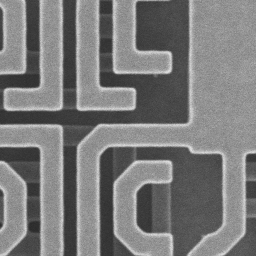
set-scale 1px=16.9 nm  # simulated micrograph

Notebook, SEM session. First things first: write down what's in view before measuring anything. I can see wiring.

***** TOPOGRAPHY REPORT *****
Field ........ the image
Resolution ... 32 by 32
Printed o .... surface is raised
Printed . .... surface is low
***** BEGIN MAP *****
ooo..ooo..oo..ooo.......oooooooo
ooo..ooo..oo..ooo.......oooooooo
.oo..ooo..oo..ooo.......oooooooo
.oo..ooo..oo..ooo.......oooooooo
.oo..ooo..oo..ooo.......oooooooo
.oo..ooo..oo..ooo.......oooooooo
ooo..ooo..oo..oooooo....oooooooo
ooo..ooo..oo..ooooooo...oooooooo
ooo..ooo..oo..ooooooo...oooooooo
.....ooo..oo............oooooooo
.....ooo..ooo...........oooooooo
.ooooooo..ooooooo.......oooooooo
.ooooooo..ooooooo.......oooooooo
.ooooooo..ooooooo.......oooooooo
........................oooooooo
.......................ooooooooo
oooooooo...ooooooooooooooooooooo
oooooooo..oooooooooooooooooooooo
.....ooo..ooo..........ooooooooo
.....ooo..ooo...............ooo.
o....ooo..oo.....oooo.......ooo.
oo...ooo..oo...oooooo.......ooo.
ooo..ooo..oo...oooooo.......ooo.
ooo..ooo..oo..oooo..........ooo.
.oo..ooo..oo..ooo...........ooo.
.oo..ooo..oo..ooo...........ooo.
.oo..ooo..oo..ooo...........ooo.
.oo..ooo..oo..ooo...........ooo.
ooo..ooo..oo..ooo..........oooo.
ooo..ooo..oo..ooooooo.....oooo..
oo...ooo..oo...ooooooo...oooo...
o....ooo..oo....oooooo..oooo....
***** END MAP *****